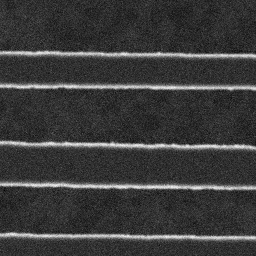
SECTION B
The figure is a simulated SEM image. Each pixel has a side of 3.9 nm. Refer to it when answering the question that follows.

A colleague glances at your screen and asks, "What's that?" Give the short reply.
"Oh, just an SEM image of lines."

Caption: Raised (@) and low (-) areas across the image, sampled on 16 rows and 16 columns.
----------------
----------------
----------------
@@@@@@@@@@@@@@@@
@@@@@@@@@@@@@@@@
------@--@@@@@@@
----------------
----------------
----------------
@@@@@@@@@@@@@@@@
@@@@@@@@@@@@@@@@
@@@@@@@@@@@@@@@@
----------------
----------------
----------------
@@@@@@@@@@@@@@@@